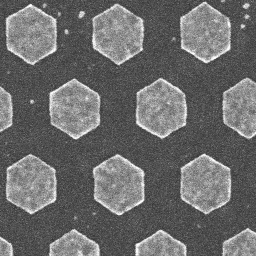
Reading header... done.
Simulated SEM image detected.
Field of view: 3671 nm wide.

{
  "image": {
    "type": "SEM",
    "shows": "a regular array of raised bodies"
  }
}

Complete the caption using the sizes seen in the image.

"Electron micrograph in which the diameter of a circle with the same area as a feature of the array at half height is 759 nm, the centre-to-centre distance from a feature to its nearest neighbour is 1.24 µm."